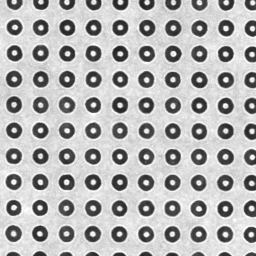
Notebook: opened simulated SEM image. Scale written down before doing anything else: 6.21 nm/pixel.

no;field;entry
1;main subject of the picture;a regular array of ring-shaped grooves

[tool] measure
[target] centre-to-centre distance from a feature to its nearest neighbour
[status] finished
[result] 0.16 micrometres